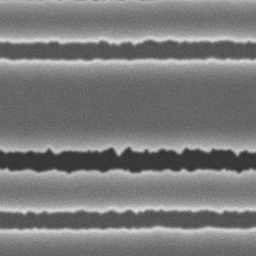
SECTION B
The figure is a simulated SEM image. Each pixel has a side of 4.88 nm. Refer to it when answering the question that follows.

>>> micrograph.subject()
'lines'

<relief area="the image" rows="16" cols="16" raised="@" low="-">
@@@@@@@@@@@@@@@@
@@@@@@@@@@@@@@@@
@@@@@@@@@@@@@@@@
@@@@@@@@@@@@@@@@
@@@@@@@@@@@@@@@@
@@@@@@@@@@@@@@@@
@@@@@@@@@@@@@@@@
@@@@@@@@@@@@@@@@
@@@@@@@@@@@@@@@@
--@-------------
----------------
@@@@@@@@@@@@@@@@
@@@@@@@@@@@@@@@@
@@@@@@@@@@@@@@@@
@@@@@@@@@@@@@@@@
@@@@@@@@@@@@@@@@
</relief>